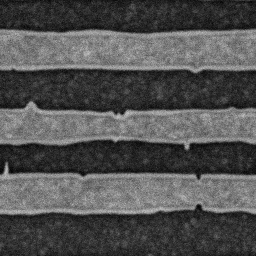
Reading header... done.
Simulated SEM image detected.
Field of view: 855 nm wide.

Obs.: one or a few lines or trenches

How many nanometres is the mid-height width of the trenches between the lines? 128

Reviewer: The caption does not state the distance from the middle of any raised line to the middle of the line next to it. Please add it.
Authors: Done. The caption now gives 239 nm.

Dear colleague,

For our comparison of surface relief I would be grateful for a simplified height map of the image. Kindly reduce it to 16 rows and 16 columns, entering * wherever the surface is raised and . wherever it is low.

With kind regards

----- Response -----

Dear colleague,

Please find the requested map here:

................
................
****************
****************
................
................
................
****************
****************
................
................
****************
****************
................
................
................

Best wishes